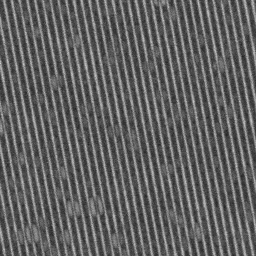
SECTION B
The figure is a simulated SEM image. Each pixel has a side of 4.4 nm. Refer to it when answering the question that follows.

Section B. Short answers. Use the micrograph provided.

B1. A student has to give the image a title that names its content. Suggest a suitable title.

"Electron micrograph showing parallel lines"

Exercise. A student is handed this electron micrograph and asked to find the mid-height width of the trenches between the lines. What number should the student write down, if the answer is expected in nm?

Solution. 27.1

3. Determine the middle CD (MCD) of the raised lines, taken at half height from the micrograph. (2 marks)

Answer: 1.34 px